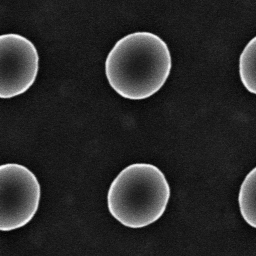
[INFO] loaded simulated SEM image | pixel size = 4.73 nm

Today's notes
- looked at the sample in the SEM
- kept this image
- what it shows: raised bodies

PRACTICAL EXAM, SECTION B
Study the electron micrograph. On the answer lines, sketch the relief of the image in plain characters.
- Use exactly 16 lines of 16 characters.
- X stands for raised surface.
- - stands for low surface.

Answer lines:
----------------
----------------
XX------XX------
XX-----XXXX----X
XX-----XXXX----X
XX-----XXX------
----------------
----------------
----------------
----------------
X-------XX------
XX-----XXX-----X
XX-----XXX-----X
XX-----XXX-----X
----------------
----------------